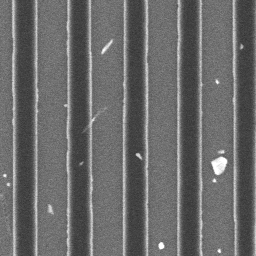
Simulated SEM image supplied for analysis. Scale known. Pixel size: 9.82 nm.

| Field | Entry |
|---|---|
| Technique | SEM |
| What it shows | lines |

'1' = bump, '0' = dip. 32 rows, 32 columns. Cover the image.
00111000011000001100001110000111
00111000011000001100001110000111
00111000011000001100001110000111
00111000111000001100001110000111
00111000011000001100001110000111
00111000011000001100001110000111
00111000011000001100001110000111
00111000011000001100001110000111
00111000011000001100001110000111
00111000011000001100001110000111
00111000011000001100001110000111
00111000011000001100001110000111
00111000011000001100001110000111
00111000011000001100001110000111
00111000011000011100001110000111
00111000111000011100001110000111
00111000111000011100001110000111
00111000111000011100001110000111
00111000011000011100001110000111
00111000111000011100001110000111
00111000111000011100001110010111
00111000111000011100001110000111
00111000011000011100001110000111
00111000011000011100001110000111
00111000011000011100001110000111
00111000011000011100001110000111
00111000011000011100001110000111
00111000011000011100001110000111
00111000011000011100001110000111
00111000111000011100001110000111
00111000111000011100001110000111
00111000111000011100001110000111